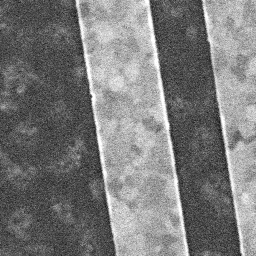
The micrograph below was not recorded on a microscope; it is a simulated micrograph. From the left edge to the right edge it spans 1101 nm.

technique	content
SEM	one or a few lines or trenches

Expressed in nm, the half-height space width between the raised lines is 230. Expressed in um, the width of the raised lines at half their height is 0.306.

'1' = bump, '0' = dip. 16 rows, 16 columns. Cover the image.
0000011110000111
0000011110000111
0000011111000111
0000011111000111
0000011111000111
0000001111000011
0000001111000011
0000001111000011
0000001111100011
0000001111100011
0000001111100011
0000000111100011
0000000111100001
0000000111100001
0000000111110001
0000000111110001